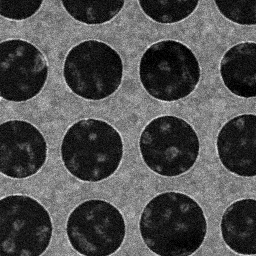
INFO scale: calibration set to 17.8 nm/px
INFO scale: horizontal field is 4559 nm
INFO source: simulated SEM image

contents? holes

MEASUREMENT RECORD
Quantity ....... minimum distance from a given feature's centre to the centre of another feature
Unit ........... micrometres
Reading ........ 1.34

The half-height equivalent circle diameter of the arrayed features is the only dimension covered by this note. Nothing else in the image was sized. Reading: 1080 nanometres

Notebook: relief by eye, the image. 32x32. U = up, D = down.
DDDDDUUUDDDDDDDUUDDDDDDDDUUDDDDD
DDDDDUUUDDDDDDDUUUDDDDDDUUUUDDDD
UUDUUUUUUDDDDDUUUUUDDDDUUUUUUDDD
UUUUUUUUUUUUUUUUUUUUUUUUUUUUUUUU
UUUUUUUUUUUUUUUUUUUUUUUUUUUUUUUU
DDDDUUUUUUDDDUUUUUUDDDDUUUUUUUDD
DDDDDUUUUDDDDDDUUUDDDDDDUUUUDDDD
DDDDDDUUDDDDDDDUUUDDDDDDDUUUDDDD
DDDDDDUUDDDDDDDUUDDDDDDDDUUDDDDD
DDDDDDUUDDDDDDDUUDDDDDDDDUUUDDDD
DDDDDDUUDDDDDDDUUUDDDDDDDUUUDDDD
DDDDDUUUUDDDDDUUUUDDDDDDUUUUUDDD
UDDUUUUUUUUDUUUUUUUUDDUUUUUUUUUU
UUUUUUUUUUUUUUUUUUUUUUUUUUUUUUUU
UUUUUUUUUUUUUUUUUUUUDDUUUUUUUUDD
DDDDUUUUUDDDDDUUUUDDDDDDUUUUDDDD
DDDDDUUUDDDDDDDUUUDDDDDDUUUDDDDD
DDDDDDUUDDDDDDDUUDDDDDDDDUUDDDDD
DDDDDDUUDDDDDDDUUDDDDDDDDUUDDDDD
DDDDDDUUDDDDDDDUUUDDDDDDDUUDDDDD
DDDDDUUUDDDDDDDUUUDDDDDDUUUUDDDD
DDDDDUUUUDDDDDUUUUUDDDDUUUUUUDDD
UUUUUUUUUUDDDUUUUUUUUUUUUUUUUUUU
UUUUUUUUUUUUUUUUUUUUUUUUUUUUUUUU
UDDDUUUUUUUUUUUUUUUUDDDUUUUUUUUU
DDDDDUUUUUDDDDUUUUDDDDDDDUUUUDDD
DDDDDDUUUDDDDDDUUUDDDDDDDUUUDDDD
DDDDDDUUDDDDDDDDUDDDDDDDDDUUDDDD
DDDDDDDUDDDDDDDDUDDDDDDDDDUUDDDD
DDDDDDUUDDDDDDDDUUDDDDDDDDUUDDDD
DDDDDDUUUDDDDDDUUUDDDDDDDUUUDDDD
DDDDDUUUUUDDDDUUUUUDDDDDUUUUUDDD